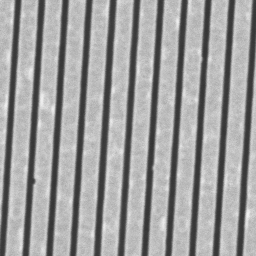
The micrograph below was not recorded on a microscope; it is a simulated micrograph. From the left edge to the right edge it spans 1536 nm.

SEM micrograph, parallel lines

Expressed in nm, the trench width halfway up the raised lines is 38.2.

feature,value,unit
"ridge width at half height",104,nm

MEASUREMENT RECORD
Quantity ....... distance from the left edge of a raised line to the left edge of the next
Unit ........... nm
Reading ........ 142